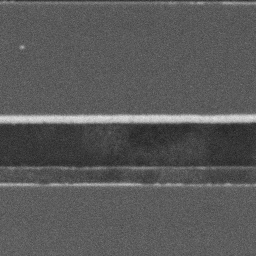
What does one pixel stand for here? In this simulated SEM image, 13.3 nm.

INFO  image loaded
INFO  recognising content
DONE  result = lines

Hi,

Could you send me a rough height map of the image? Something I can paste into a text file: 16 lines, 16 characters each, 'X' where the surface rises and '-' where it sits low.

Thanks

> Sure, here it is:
XXXXXXXXXXXXXXXX
XXXXXXXXXXXXXXXX
XXXXXXXXXXXXXXXX
XXXXXXXXXXXXXXXX
XXXXXXXXXXXXXXXX
XXXXXXXXXXXXXXXX
XXXXXXXXXXXXXXXX
XXXXXXXXXXXXXXXX
----------------
----------------
----------------
----------------
XXXXXXXXXXXXXXXX
XXXXXXXXXXXXXXXX
XXXXXXXXXXXXXXXX
XXXXXXXXXXXXXXXX